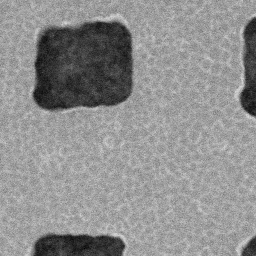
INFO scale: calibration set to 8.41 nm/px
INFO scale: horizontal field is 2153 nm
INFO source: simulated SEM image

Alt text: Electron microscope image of holes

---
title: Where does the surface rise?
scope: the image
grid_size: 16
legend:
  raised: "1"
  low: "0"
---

1111111111111111
1111100011111110
1100000011111110
1100000011111110
1100000011111110
1100000011111110
1100000111111110
1111111111111111
1111111111111111
1111111111111111
1111111111111111
1111111111111111
1111111111111111
1111111111111111
1111111111111111
1100000011111110